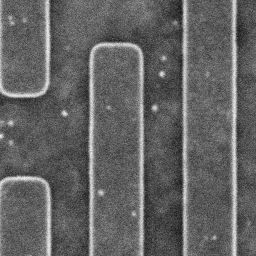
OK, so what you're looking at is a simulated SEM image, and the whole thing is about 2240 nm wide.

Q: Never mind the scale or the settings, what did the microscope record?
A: wiring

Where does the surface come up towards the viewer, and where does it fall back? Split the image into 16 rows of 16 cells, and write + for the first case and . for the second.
+++.........+++.
+++.........+++.
+++.........+++.
+++...+++...+++.
+++...+++...+++.
+++...+++...+++.
......+++...+++.
......+++...+++.
......+++...+++.
......+++...+++.
......+++...+++.
+++...+++...+++.
+++...+++...+++.
+++...+++...+++.
+++...+++...+++.
+++...+++...+++.